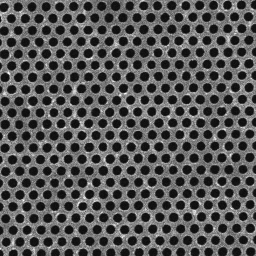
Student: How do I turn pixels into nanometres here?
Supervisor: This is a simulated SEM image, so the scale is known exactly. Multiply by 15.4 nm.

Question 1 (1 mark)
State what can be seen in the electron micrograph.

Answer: a regular array of holes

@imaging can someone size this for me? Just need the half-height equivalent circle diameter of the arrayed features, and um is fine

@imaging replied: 0.146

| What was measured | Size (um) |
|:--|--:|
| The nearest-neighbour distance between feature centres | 0.208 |